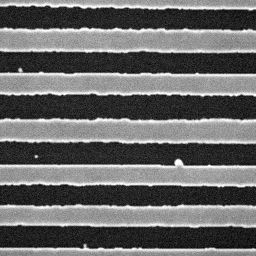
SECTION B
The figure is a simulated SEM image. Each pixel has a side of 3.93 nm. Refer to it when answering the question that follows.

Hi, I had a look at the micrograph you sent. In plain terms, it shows lines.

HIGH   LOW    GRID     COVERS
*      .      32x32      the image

********************************
................................
................................
................................
********************************
********************************
..............**....************
................................
................................
********************************
********************************
********************************
................................
................................
................................
********************************
********************************
********************************
................................
................................
......................*.........
********************************
********************************
................................
................................
................................
********************************
********************************
................................
................................
................................
********************************